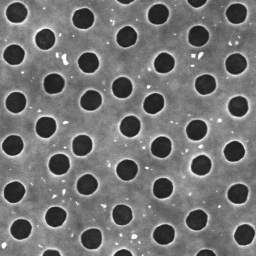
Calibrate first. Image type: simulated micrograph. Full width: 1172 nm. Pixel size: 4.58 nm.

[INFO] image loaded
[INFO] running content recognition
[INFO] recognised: a regular array of holes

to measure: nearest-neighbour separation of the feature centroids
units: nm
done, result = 173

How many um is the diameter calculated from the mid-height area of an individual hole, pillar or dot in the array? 0.0965